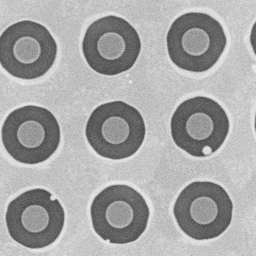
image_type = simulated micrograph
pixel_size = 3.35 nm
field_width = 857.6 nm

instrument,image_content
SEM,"an array of small figures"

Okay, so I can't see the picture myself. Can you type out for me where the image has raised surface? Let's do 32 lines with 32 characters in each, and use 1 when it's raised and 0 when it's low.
11111111111111111111111111111111
11111111111111111111111000111111
11111111111100001111110000011111
10000011111000000111100000001110
00000001110001100111100111001110
00111001110011100011100111001110
00111001110011100111100110001111
00010001111000000111100000001111
00000001111000001111110000011111
10000011111111111111111111111111
11111111111111111111111111111111
11111111111111111111111111111111
11111111111111111111111000011111
11000011111100000111110000001111
10000001111000000011100011000111
00011001111001110011100111100111
00111000111001110011100011000111
00111000111001110011110000001111
00000001111000000011110000001111
10000001111100000111111100111111
11100111111111111111111111111111
11111111111111111111111111111111
11111111111111111111111111111111
11110111111110000111111000001111
11000001111100000011110000000111
10000000111000110001110011100111
10011100111001110001110011100111
10011100111000110001110011100111
10011100111100000011110000001111
10000000111100000011111000011111
11100001111111001111111111111111
11111111111111111111111111111111